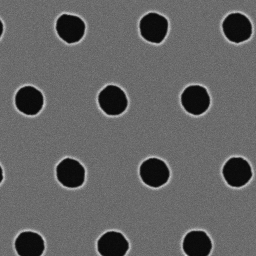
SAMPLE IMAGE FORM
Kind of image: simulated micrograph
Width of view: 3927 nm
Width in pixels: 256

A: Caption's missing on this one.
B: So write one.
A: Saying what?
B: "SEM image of a regular array of holes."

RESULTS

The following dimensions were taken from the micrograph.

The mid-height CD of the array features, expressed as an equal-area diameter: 451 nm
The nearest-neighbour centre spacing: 83.1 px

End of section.